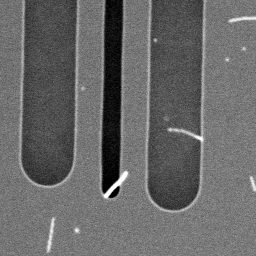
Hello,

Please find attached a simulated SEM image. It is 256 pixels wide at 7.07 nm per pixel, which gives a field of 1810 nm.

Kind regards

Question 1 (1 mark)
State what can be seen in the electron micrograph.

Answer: groups of lines, slits or small figures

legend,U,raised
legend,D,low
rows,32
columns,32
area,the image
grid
UUUDDDDDDDUUUDDUUUUDDDDDDUUUUUUU
UUUDDDDDDDUUUDDUUUUDDDDDDUUUUUUU
UUUDDDDDDDUUUDDUUUUDDDDDDUUUUUUU
UUUDDDDDDDUUUDDUUUUDDDDDDUUUUUUU
UUUDDDDDDDUUUDDUUUUDDDDDDUUUUUUU
UUUDDDDDDDUUUDDUUUUDDDDDDUUUUUUU
UUUDDDDDDDUUUDDUUUUDDDDDDUUUUUUU
UUUDDDDDDDUUUDDUUUUDDDDDDUUUUUUU
UUUDDDDDDDUUUDDUUUUDDDDDDUUUUUUU
UUUDDDDDDUUUUDDUUUUDDDDDDUUUUUUU
UUUDDDDDDUUUUDDUUUUDDDDDDUUUUUUU
UUUDDDDDDUUUUDDUUUUDDDDDDUUUUUUU
UUUDDDDDDUUUUDDUUUUDDDDDDUUUUUUU
UUUDDDDDDUUUUDDUUUUDDDDDDUUUUUUU
UUUDDDDDDUUUUDDUUUUDDDDDDUUUUUUU
UUUDDDDDDUUUUDDUUUUDDDDDDUUUUUUU
UUUDDDDDDUUUUDDUUUDDDDDDDUUUUUUU
UUUDDDDDDUUUUDDUUUDDDDDDDUUUUUUU
UUUDDDDDDUUUUDDUUUDDDDDDDUUUUUUU
UUUDDDDDDUUUUDDUUUDDDDDDDUUUUUUU
UUUDDDDDDUUUUDDUUUDDDDDDDUUUUUUU
UUUDDDDDDUUUUDDUUUDDDDDDDUUUUUUU
UUUUDDDDUUUUUDDUUUDDDDDDDUUUUUUU
UUUUUUUUUUUUUDDUUUDDDDDDDUUUUUUU
UUUUUUUUUUUUUUUUUUUDDDDDDUUUUUUU
UUUUUUUUUUUUUUUUUUUDDDDDUUUUUUUU
UUUUUUUUUUUUUUUUUUUUUUUUUUUUUUUU
UUUUUUUUUUUUUUUUUUUUUUUUUUUUUUUU
UUUUUUUUUUUUUUUUUUUUUUUUUUUUUUUU
UUUUUUUUUUUUUUUUUUUUUUUUUUUUUUUU
UUUUUUUUUUUUUUUUUUUUUUUUUUUUUUUU
UUUUUUUUUUUUUUUUUUUUUUUUUUUUUUUU